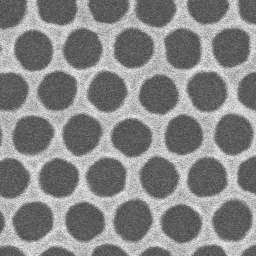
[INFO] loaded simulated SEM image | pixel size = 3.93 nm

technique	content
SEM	a regular array of holes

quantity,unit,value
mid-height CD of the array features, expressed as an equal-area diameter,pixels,40.1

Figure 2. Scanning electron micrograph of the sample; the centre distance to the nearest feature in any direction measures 190 nanometers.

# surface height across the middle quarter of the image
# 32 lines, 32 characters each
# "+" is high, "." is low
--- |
++.....++++++++.....+++++++.....
+++++++++++++++++++++++++++++..+
.+++++++.....+++++++++++++++++++
...++++.......+++++++.....++++++
...++++........+++++........+++.
...+++.........++++.........+++.
...+++..........+++.........+++.
...+++..........+++..........++.
...+++.........+++...........++.
..++++.........++++.........++++
.++++++.......+++++.........++++
++++++++.....+++++++.......+++++
+++...++++++++++++++++....++++++
++.....++++++++++++++++++++.....
+.......++++++.....+++++++......
.........++++........+++++......
.........+++..........+++.......
.........+++..........+++.......
.........++...........+++.......
.........+++..........+++.......
........++++.........++++.......
+......++++++........+++++......
++....++++++++......++++++++...+
++++++++++..++++.++++....+++++++
.+++++++......++++++.......+++++
...++++........+++++........++++
...+++..........+++.........+++.
....++..........+++..........++.
....+...........+++..........++.
....++..........+++..........+..
...+++.........+++++........+++.
...++++........+++++........+++.